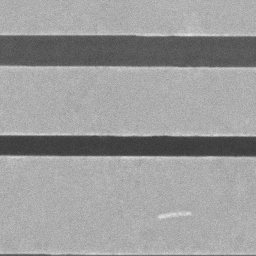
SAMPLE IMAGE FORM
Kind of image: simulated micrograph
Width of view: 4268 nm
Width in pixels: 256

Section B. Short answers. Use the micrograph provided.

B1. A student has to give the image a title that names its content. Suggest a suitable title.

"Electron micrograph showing lines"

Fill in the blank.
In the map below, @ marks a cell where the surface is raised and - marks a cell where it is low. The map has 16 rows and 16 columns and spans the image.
@@@@@@@@@@@@@@@@
@@@@@@@@@@@@@@@@
----------------
----------------
@@@@@@@@@@@@@@@@
@@@@@@@@@@@@@@@@
@@@@@@@@@@@@@@@@
@@@@@@@@@@@@@@@@
----------------
----------------
@@@@@@@@@@@@@@@@
@@@@@@@@@@@@@@@@
@@@@@@@@@@@@@@@@
@@@@@@@@@@@@@@@@
@@@@@@@@@@@@@@@@
@@@@@@@@@@@@@@@@